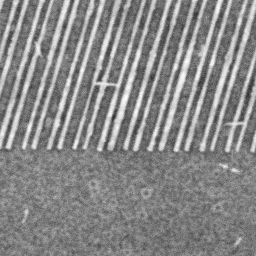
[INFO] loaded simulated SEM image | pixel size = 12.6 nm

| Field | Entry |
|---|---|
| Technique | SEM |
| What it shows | parallel lines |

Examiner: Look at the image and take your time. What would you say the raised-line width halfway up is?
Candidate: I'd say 0.0439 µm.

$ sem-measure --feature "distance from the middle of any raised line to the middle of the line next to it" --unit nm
154